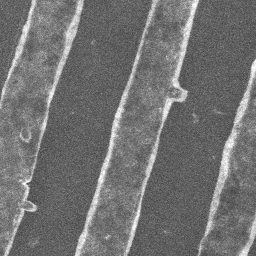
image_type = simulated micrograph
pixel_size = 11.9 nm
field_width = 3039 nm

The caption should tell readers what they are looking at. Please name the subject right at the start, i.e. one or a few lines or trenches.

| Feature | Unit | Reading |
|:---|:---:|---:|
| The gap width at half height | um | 0.82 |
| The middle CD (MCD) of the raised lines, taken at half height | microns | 0.533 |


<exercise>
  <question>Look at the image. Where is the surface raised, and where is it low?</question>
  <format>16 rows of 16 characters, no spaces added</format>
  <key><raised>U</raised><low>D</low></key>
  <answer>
DDUUUDDDDDUUDDDD
DDUUUDDDDUUUDDDD
DUUUDDDDDUUUDDDD
DUUUDDDDDUUDDDDD
DUUUDDDDUUUDDDDD
UUUDDDDDUUUDDDDD
UUUDDDDDUUUDDDDU
UUUDDDDUUUDDDDDU
UUUDDDDUUUDDDDDU
UUDDDDDUUUDDDDUU
UUDDDDDUUDDDDDUU
UUDDDDUUUDDDDDUU
UUDDDDUUUDDDDUUU
UDDDDDUUUDDDDUUU
UDDDDUUUDDDDDUUU
UDDDDUUUDDDDUUUD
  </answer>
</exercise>